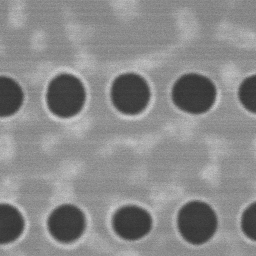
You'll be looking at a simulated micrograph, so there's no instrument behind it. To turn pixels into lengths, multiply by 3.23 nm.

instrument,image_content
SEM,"holes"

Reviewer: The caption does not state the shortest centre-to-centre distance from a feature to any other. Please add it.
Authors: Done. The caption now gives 64.1 pixels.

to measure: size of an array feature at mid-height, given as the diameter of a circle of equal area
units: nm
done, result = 140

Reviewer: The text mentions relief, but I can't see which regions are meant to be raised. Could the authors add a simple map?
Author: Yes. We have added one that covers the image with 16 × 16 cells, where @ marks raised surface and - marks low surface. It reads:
@@@@@@@@@@@@@@@@
@@@@@@@@@@@@@@@@
@@@@@@@@@@@@@@@@
@@@@@@@@@@@@@@@@
@@@@@@@@@@@@@@@@
-@@--@@--@@--@@-
-@@--@@--@@--@@-
@@@@@@@@@@@@@@@@
@@@@@@@@@@@@@@@@
@@@@@@@@@@@@@@@@
@@@@@@@@@@@@@@@@
@@@@@@@@@@@@@@@@
@@@@@@@@@@@@@@@@
-@@--@@--@@---@-
-@@--@@--@@--@@-
@@@@@@@@@@@@@@@@